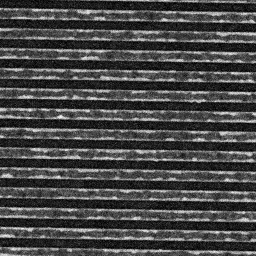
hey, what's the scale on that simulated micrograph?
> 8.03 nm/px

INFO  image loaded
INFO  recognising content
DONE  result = parallel lines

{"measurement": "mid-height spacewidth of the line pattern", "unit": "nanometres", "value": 79.3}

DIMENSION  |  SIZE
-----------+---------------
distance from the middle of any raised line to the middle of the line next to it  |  160 nm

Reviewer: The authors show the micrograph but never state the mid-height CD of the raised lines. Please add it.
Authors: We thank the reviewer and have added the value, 0.0793 um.